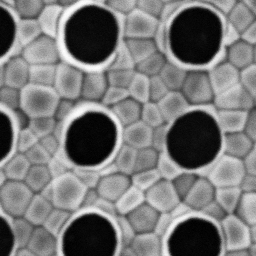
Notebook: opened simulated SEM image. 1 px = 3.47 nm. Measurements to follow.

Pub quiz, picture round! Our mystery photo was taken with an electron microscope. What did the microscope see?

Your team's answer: holes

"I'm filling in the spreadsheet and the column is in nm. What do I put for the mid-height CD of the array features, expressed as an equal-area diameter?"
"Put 197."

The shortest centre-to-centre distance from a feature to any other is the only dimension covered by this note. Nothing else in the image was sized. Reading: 0.359 um